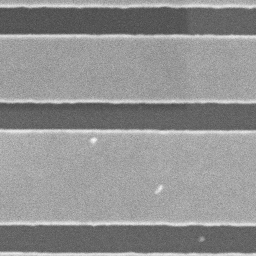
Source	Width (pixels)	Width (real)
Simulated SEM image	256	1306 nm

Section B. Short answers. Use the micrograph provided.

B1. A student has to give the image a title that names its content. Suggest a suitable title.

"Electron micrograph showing lines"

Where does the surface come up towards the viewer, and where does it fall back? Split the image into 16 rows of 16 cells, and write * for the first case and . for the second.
................
................
****************
****************
****************
****************
................
................
****************
****************
****************
****************
****************
****************
................
................